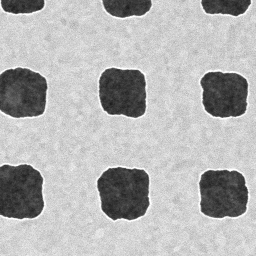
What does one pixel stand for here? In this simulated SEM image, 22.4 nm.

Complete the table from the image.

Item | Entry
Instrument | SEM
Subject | holes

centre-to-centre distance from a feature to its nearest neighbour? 2230 nanometers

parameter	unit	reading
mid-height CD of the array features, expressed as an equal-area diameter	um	1.17